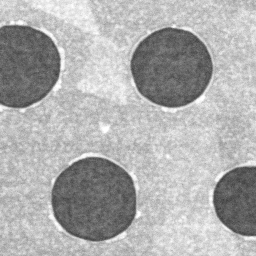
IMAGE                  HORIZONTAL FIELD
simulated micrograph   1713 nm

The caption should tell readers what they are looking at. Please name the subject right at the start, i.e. holes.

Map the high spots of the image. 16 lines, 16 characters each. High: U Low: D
UUUUUUUUUUUUUUUU
UUUUUUUUUUUUUUUU
DDDUUUUUUDDDDUUU
DDDDUUUUDDDDDUUU
DDDDUUUUDDDDDUUU
DDDUUUUUUDDDDUUU
DDUUUUUUUUDDUUUU
UUUUUUUUUUUUUUUU
UUUUUUUUUUUUUUUU
UUUUUUUUUUUUUUUU
UUUUDDDDUUUUUUUD
UUUDDDDDUUUUUUDD
UUUDDDDDDUUUUDDD
UUUDDDDDUUUUUUDD
UUUUDDDDUUUUUUUD
UUUUUUUUUUUUUUUU